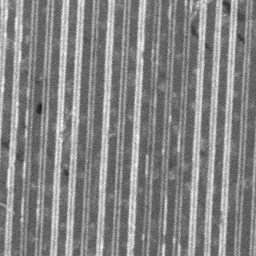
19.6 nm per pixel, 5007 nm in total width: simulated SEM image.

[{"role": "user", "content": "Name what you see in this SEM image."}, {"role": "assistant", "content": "parallel lines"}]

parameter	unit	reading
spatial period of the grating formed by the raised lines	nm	299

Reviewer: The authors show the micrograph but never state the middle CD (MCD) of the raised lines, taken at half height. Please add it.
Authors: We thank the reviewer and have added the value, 92.8 nanometers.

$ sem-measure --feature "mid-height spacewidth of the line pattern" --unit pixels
10.6